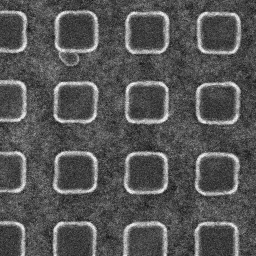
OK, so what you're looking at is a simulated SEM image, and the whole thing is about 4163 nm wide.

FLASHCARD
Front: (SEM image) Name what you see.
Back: a regular array of raised bodies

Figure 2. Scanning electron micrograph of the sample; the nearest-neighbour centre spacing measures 1140 nanometers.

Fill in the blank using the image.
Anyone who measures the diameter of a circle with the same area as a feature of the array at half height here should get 708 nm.